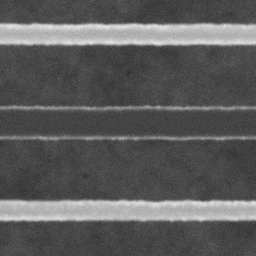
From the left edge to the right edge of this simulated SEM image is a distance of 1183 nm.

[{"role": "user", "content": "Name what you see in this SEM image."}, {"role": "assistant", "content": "lines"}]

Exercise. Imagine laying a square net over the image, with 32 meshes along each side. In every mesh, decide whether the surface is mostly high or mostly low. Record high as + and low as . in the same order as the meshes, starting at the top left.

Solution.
................................
................................
................................
++++++++++++++++++++++++++++++++
++++++++++++++++++++++++++++++++
................................
................................
................................
................................
................................
................................
................................
................................
+++.+...........+.++............
++++++++++++++++++++++++++++++++
++++++++++++++++++++++++++++++++
++++++++++++++++++++++++++++++++
................................
................................
................................
................................
................................
................................
................................
................................
++++++++++++++++++++++++++++++++
++++++++++++++++++++++++++++++++
................................
................................
................................
................................
................................